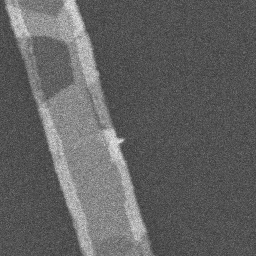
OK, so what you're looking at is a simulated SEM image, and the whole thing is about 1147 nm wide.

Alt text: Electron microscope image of one or a few lines or trenches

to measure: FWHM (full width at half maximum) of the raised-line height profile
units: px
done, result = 59.1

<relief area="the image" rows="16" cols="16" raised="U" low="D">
DUUUUDDDDDDDDDDD
DUUUUDDDDDDDDDDD
DUUUUDDDDDDDDDDD
DDUUUDDDDDDDDDDD
DDUUUUDDDDDDDDDD
DDUUUUDDDDDDDDDD
DDDUUUDDDDDDDDDD
DDDUUUUDDDDDDDDD
DDDUUUUDDDDDDDDD
DDDUUUUDDDDDDDDD
DDDDUUUUDDDDDDDD
DDDDUUUUDDDDDDDD
DDDDUUUUDDDDDDDD
DDDDDUUUDDDDDDDD
DDDDDUUUUDDDDDDD
DDDDDUUUUDDDDDDD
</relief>